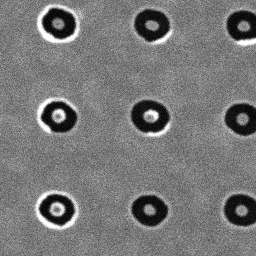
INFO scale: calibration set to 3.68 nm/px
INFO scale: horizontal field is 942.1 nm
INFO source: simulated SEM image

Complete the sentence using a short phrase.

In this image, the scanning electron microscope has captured ring-shaped grooves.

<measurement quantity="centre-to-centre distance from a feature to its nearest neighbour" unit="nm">337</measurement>